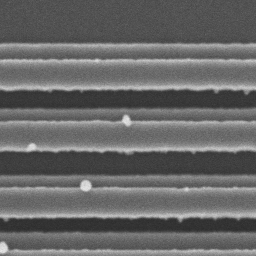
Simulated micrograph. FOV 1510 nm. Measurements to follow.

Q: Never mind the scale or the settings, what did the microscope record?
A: lines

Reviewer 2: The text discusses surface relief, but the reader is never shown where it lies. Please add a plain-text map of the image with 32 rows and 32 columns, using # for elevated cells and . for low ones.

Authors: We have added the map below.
................................
................................
................................
................................
................................
................................
################################
################################
################################
################################
################################
..............................#.
................................
................................
################################
################################
################################
################################
################################
................................
................................
................................
################################
################################
################################
################################
################################
......................#.........
................................
################################
################################
################################